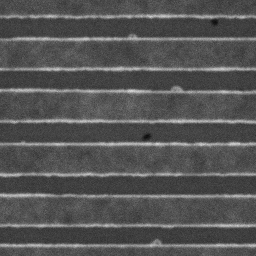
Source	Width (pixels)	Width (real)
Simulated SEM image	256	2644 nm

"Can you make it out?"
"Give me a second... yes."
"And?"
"lines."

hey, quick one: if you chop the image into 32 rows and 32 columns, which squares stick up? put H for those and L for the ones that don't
HHHHHHHHHHHHHHHHHHHHHHHHHHHHHHHH
HHHHHHHHHHHHHHHHHHHHHHHHHHHHHHHH
LLLLLLLLLLLLLLLLLLLLLLLLLLLLLLLL
LLLLLLLLLLLLLLLLLLLLLLLLLLLLLLLL
LLLLLLLLLLLLLLLLLLLLLLLLLLLLLLLL
HHHHHHHHHHHHHHHHHHHHHHHHHHHHHHHH
HHHHHHHHHHHHHHHHHHHHHHHHHHHHHHHH
HHHHHHHHHHHHHHHHHHHHHHHHHHHHHHHH
HHHHHHHHHHHHHHHHHHHHHHHHHHHHHHHH
LLLLLLLLLLLLLLLLLLLLLLLLLLLLLLLL
LLLLLLLLLLLLLLLLLLLLLLLLLLLLLLLL
HHHHHHHHHHHHHHHHHHHHHHHHHHHHLLLL
HHHHHHHHHHHHHHHHHHHHHHHHHHHHHHHH
HHHHHHHHHHHHHHHHHHHHHHHHHHHHHHHH
HHHHHHHHHHHHHHHHHHHHHHHHHHHHHHHH
LLLLLLLLLLLLLLLLLLLLLLLLLLLLLLLL
LLLLLLLLLLLLLLLLLLLLLLLLLLLLLLLL
LLLLLLLLLLLLLLLLLLLLLLLLLLLLLLLL
HHHHHHHHHHHHHHHHHHHHHHHHHHHHHHHH
HHHHHHHHHHHHHHHHHHHHHHHHHHHHHHHH
HHHHHHHHHHHHHHHHHHHHHHHHHHHHHHHH
HHHHHHHHHHHHHHHHHHHHHHHHHHHHHHHH
LLLLLLLLLLLLLLLLLLLLLLLLLLLLLLLL
LLLLLLLLLLLLLLLLLLLLLLLLLLLLLLLL
HHHHHHHHHHHHHHHHHHHHHHHHHHHHHHHL
HHHHHHHHHHHHHHHHHHHHHHHHHHHHHHHH
HHHHHHHHHHHHHHHHHHHHHHHHHHHHHHHH
HHHHHHHHHHHHHHHHHHHHHHHHHHHHHHHH
LLLLLLLLLLLLLLLLLLLLLLLLLLLLLLLL
LLLLLLLLLLLLLLLLLLLLLLLLLLLLLLLL
LLLLLLLLLLLLLLLLLLLLLLLLLLLLLLLL
HHHHHHHHHHHHHHHHHHHHHHHHHHHHHHHH